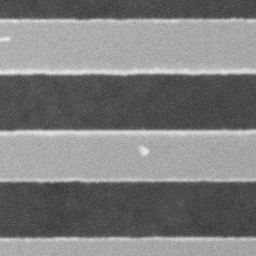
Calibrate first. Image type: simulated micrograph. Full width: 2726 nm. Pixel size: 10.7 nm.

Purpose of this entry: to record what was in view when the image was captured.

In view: lines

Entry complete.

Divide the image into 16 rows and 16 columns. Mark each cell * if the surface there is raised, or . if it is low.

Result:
................
****************
****************
****************
****************
................
................
................
****************
****************
****************
................
................
................
................
****************